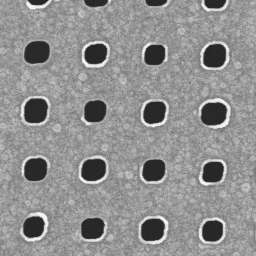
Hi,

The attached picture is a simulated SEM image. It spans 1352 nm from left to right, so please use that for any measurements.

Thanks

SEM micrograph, a regular array of holes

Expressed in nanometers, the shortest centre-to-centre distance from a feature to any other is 305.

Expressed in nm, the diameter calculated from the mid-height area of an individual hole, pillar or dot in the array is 123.